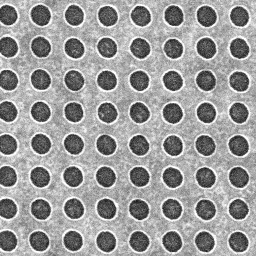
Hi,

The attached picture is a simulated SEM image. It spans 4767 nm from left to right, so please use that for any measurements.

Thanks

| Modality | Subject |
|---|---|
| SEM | a regular array of holes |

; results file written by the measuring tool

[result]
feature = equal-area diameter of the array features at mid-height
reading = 392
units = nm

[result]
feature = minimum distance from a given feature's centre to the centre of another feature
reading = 595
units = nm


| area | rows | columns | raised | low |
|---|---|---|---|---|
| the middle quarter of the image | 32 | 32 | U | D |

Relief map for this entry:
UUUUUUUUUUUUUUUUUUUUUUUUUUUUUUUU
UUDUUUUUUUDUUUUUUUUUUUUUUUUUUUUU
DDDDDUUUUDDDDUUUUDDDDUUUUDDDDUUU
DDDDDUUUDDDDDUUUDDDDDUUUUDDDDDUU
DDDDDUUUDDDDDUUUDDDDDUUUUDDDDDUU
DDDDDUUUUDDDDUUUUDDDDUUUUDDDDDUU
UUDDUUUUUUDDUUUUUUDDUUUUUUDDDUUU
UUUUUUUUUUUUUUUUUUUUUUUUUUUUUUUU
UUUUUUUUUUUUUUUUUUUUUUUUUUUUUUUU
UUUUUUUUUUUUUUUUUUDUUUUUUUUUUUUU
DDDDDUUUUDDDDUUUUDDDDUUUUDDDDUUU
DDDDDUUUDDDDDUUUDDDDDUUUUDDDDUUU
DDDDDUUUDDDDDDUUDDDDDDUUUDDDDDUU
UDDDDUUUUDDDDUUUUDDDDUUUUDDDDDUU
UUDDUUUUUUDDUUUUUUDDUUUUUUDDDUUU
UUUUUUUUUUUUUUUUUUUUUUUUUUUUUUUU
UUUUUUUUUUUUUUUUUUUUUUUUUUUUUUUU
UDDUUUUUUUUUUUUUUUUUUUUUUUUUUUUU
DDDDUUUUDDDDUUUUUDDDDUUUUDDDDUUU
DDDDDUUUDDDDDUUUDDDDDUUUUDDDDDUU
DDDDDUUUDDDDDUUUDDDDDUUUUDDDDDUU
UDDDDUUUDDDDDUUUUDDDDUUUUDDDDDUU
UUDDUUUUUDDDUUUUUUDDDUUUUUDDDUUU
UUUUUUUUUUUUUUUUUUUUUUUUUUUUUUUU
UUUUUUUUUUUUUUUUUUUUUUUUUUUUUUUU
UUDUUUUUUUDUUUUUUUDUUUUUUUUUUUUU
DDDDUUUUDDDDUUUUUDDDDUUUUDDDDUUU
DDDDDUUUDDDDDUUUDDDDDUUUUDDDDUUU
DDDDDUUUDDDDDUUUDDDDDUUUUDDDDDUU
DDDDDUUUDDDDDUUUUDDDDUUUUDDDDDUU
UDDDUUUUUDDDUUUUUUDDUUUUUUDDDUUU
UUUUUUUUUUUUUUUUUUUUUUUUUUUUUUUU